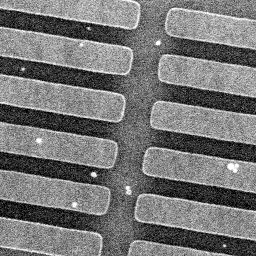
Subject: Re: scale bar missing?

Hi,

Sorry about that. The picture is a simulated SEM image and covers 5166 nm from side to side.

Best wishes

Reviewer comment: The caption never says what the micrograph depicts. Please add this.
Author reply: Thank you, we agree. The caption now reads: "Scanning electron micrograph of groups of lines, slits or small figures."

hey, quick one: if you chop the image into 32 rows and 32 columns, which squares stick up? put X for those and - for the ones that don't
XXXXXXXXXXXXXXXXX---------------
---XXXXXXXXXXXXXX----XXXX-------
---------XXXXXXXX----XXXXXXXXXX-
X--------------XX----XXXXXXXXXXX
XXXXXXX---------------XXXXXXXXXX
XXXXXXXXXXXXX---------------XXXX
XXXXXXXXXXXXXXXX----------------
---XXXXXXXXXXXXX----XXXXXX------
---------XXXXXXX----XXXXXXXXXXXX
X-------------------XXXXXXXXXXXX
XXXXXXX---------------XXXXXXXXXX
XXXXXXXXXXXXXX--------------XXXX
XXXXXXXXXXXXXXXX----------------
----XXXXXXXXXXXX---XXXXXXX------
----------XXXXX----XXXXXXXXXXXXX
X------------------XXXXXXXXXXXXX
XXXXXXXX--------------XXXXXXXXXX
XXXXXXXXXXXXXX--------------XXXX
XXXXXXXXXXXXXXX----X------------
----XXXXXXXXXX----XXXXXXXX------
----------XXXX----XXXXXXXXXXXXXX
XX----------------XXXXXXXXXXXXXX
XXXXXXXX--------------XXXXXXXXXX
XXXXXXXXXXXXX----------------XXX
XXXXXXXXXXXXXX----XX------------
----XXXXXXXXXX---XXXXXXXXX------
----------XXX----XXXXXXXXXXXXXXX
XX---------------XXXXXXXXXXXXXXX
XXXXXXXX---------------XXXXXXXXX
XXXXXXXXXXXX----------------XXXX
XXXXXXXXXXXXX---XXXX------------
----XXXXXXXXX---XXXXXXXXXX------